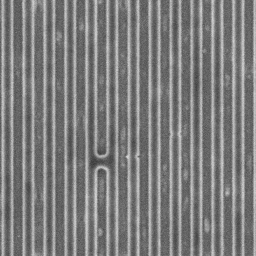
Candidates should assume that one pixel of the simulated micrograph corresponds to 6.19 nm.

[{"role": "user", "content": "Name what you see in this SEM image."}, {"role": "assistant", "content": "parallel lines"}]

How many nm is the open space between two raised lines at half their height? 63.5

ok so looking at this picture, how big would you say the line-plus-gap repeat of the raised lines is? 0.13 um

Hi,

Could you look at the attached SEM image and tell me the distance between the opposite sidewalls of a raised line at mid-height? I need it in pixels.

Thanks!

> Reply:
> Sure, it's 10.3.